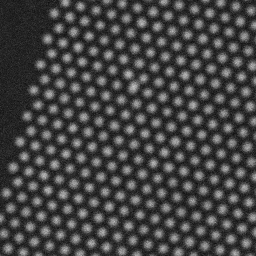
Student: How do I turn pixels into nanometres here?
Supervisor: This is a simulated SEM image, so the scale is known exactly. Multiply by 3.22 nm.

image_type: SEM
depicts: a regular array of raised bodies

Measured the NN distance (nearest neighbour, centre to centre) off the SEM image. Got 49.3 nm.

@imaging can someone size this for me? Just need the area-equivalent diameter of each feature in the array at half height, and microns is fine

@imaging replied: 0.0248